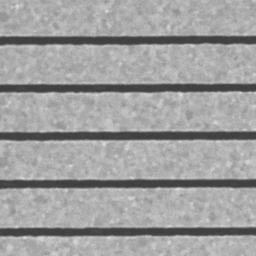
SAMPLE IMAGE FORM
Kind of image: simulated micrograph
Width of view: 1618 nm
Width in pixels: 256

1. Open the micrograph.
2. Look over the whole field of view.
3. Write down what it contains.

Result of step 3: lines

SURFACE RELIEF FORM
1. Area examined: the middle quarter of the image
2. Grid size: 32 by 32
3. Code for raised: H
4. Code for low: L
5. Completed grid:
HHHHHHHHHHHHHHHHHHHHHHHHHHHHHHHH
HHHHHHHHHHHHHHHHHHHHHHHHHHHHHHHH
HHHHHHHHHHHHHHHHHHHHHHHHHHHHHHHH
HHHHHHHHHHHHHHHHHHHHHHHHHHHHHHHH
HHHHHHHHHHHHHHHHHHHHHHHHHHHHHHHH
LLLLLLLLLLLLLLLLLLLLLLLLLLLLLLLL
LLLLLLLLLLLLLLLLLLLLLLLLLLLLLLLL
HHHHHHHHHHHHHHHHHHHHHHHHHHHHHHHH
HHHHHHHHHHHHHHHHHHHHHHHHHHHHHHHH
HHHHHHHHHHHHHHHHHHHHHHHHHHHHHHHH
HHHHHHHHHHHHHHHHHHHHHHHHHHHHHHHH
HHHHHHHHHHHHHHHHHHHHHHHHHHHHHHHH
HHHHHHHHHHHHHHHHHHHHHHHHHHHHHHHH
HHHHHHHHHHHHHHHHHHHHHHHHHHHHHHHH
HHHHHHHHHHHHHHHHHHHHHHHHHHHHHHHH
HHHHHHHHHHHHHHHHHHHHHHHHHHHHHHHH
HHHHHHHHHHHHHHHHHHHHHHHHHHHHHHHH
LLLLLLLLLLLLLLLLLLLLLLLLLLLLLLLL
LLLLLLLLLLLLLLLLLLLLLLLLLLLLLLLL
HHHHHHHHHHHHHHHHHHHHHHHHHHHHHHHH
HHHHHHHHHHHHHHHHHHHHHHHHHHHHHHHH
HHHHHHHHHHHHHHHHHHHHHHHHHHHHHHHH
HHHHHHHHHHHHHHHHHHHHHHHHHHHHHHHH
HHHHHHHHHHHHHHHHHHHHHHHHHHHHHHHH
HHHHHHHHHHHHHHHHHHHHHHHHHHHHHHHH
HHHHHHHHHHHHHHHHHHHHHHHHHHHHHHHH
HHHHHHHHHHHHHHHHHHHHHHHHHHHHHHHH
HHHHHHHHHHHHHHHHHHHHHHHHHHHHHHHH
HHHHHHHHHHHHHHHHHHHHHHHHHHHHHHHH
LLLLLLLLLLLLLLLLLLLLLLLLLLLLLLLL
LLLLLLLLLLLLLLLLLLLLLLLLLLLLLLLL
HHHHHHHHHHHHHHHHHHHHHHHHHHHHHHHH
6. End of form